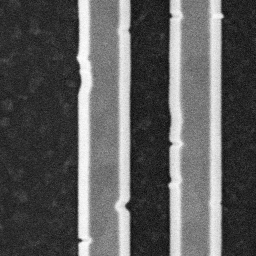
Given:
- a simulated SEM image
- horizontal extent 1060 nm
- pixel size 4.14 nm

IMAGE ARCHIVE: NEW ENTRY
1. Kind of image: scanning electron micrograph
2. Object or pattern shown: one or a few lines or trenches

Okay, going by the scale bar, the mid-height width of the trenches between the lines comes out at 0.202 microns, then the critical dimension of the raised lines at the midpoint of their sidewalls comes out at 41.9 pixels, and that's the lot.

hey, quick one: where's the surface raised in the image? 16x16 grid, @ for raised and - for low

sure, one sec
-----@@@---@@@--
-----@@@---@@@--
-----@@@---@@---
-----@@@---@@---
-----@@@---@@---
-----@@@---@@---
-----@@@---@@---
-----@@@---@@---
-----@@@---@@---
-----@@@---@@---
-----@@@---@@@--
-----@@@---@@@--
-----@@@---@@@--
-----@@@---@@---
-----@@@---@@---
-----@@@---@@---